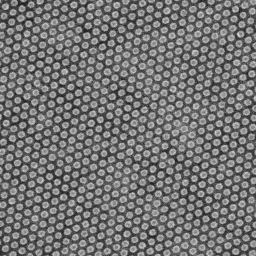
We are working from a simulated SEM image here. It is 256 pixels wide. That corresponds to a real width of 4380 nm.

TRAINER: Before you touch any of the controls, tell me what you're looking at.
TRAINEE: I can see a regular array of raised bodies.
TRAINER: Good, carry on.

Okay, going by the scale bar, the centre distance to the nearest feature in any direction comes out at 162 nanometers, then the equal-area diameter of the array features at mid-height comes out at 100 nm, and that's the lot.